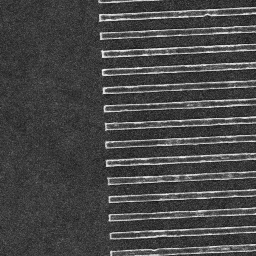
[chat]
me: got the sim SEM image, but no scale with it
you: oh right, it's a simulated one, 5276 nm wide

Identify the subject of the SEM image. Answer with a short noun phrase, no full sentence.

parallel lines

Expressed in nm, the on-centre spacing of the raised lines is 375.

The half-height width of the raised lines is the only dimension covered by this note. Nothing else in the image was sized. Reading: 0.131 um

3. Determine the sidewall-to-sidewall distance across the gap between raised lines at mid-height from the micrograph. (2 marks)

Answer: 244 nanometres